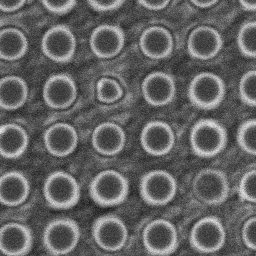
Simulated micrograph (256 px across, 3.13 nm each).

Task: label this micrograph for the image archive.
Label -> a regular array of raised bodies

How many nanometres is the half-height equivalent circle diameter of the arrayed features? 98.7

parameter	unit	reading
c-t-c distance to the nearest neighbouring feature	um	0.15